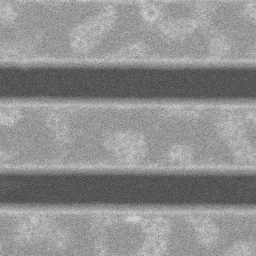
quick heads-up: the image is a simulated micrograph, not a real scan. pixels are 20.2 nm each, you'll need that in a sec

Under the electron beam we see one or a few lines or trenches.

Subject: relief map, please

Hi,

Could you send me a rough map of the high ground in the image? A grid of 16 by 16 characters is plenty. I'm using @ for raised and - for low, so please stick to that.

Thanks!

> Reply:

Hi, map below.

@@@@@@@@@@@@@@@@
@@@@@@@@@@@@@@@@
@@@@@@@@@@@@@@@@
@@@@@@@@@@@@@@@@
----------------
----------------
@@@@@@@@@@@@@@@@
@@@@@@@@@@@@@@@@
@@@@@@@@@@@@@@@@
@@@@@@@@@@@@@@@@
@@@@@@@@@@@@@@@@
----------------
----------------
@@@@@@@@@@@@@@@@
@@@@@@@@@@@@@@@@
@@@@@@@@@@@@@@@@